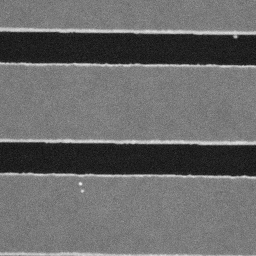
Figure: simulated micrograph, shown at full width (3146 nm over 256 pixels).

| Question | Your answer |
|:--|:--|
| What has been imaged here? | lines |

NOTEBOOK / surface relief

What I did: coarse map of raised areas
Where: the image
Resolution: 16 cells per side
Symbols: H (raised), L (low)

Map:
HHHHHHHHHHHHHHHH
HHHHHHHHHHHHHHHH
LLLLLLLLLLLLLLLL
LLLLLLLLLLLLLLLL
HHHHHHHHHHHHHHHH
HHHHHHHHHHHHHHHH
HHHHHHHHHHHHHHHH
HHHHHHHHHHHHHHHH
HHHHHHHHHHHHHHHH
LLLLLLLLLLLLLLLL
LLLLLLLLLLLLLLLL
HHHHHHHHHHHHHHHH
HHHHHHHHHHHHHHHH
HHHHHHHHHHHHHHHH
HHHHHHHHHHHHHHHH
HHHHHHHHHHHHHHHH